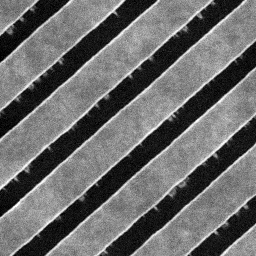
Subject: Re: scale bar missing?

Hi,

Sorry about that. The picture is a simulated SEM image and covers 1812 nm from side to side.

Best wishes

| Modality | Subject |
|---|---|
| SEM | lines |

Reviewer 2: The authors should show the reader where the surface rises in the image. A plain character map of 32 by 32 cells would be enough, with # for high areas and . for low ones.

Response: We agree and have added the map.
####....#######....#######....##
###....#######....#######....###
##....#######....#######....####
#....#######....#######....#####
....#######....#######....######
...######....#######....#######.
..######....#######....#######..
#######....#######....#######...
######....#######....#######....
#####....#######....#######....#
####....#######....#######....##
###....#######....#######....###
##....######.....######....#####
#....######....#######....######
...#######....#######....#######
..#######....#######....#######.
.#######....#######....#######..
#######....#######....######....
######....#######....######....#
#####....#######....######....##
####....#######...#######....###
###...#######....#######....####
#....#######....#######....#####
....#######....#######....######
...#######....#######....#######
..#######....#######...########.
.#######....######.....#######..
#######....######....#######....
######....######....#######....#
####....#######....#######....##
###....#######....#######....###
##....#######....#######....####